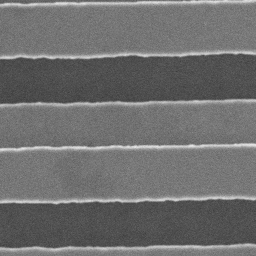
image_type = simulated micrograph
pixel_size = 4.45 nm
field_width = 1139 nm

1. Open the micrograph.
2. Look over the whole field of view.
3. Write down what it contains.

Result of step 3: lines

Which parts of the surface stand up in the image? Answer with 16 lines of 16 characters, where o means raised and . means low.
oooooooooooooooo
oooooooooooooooo
oooooooooooooooo
ooooooo..o......
................
................
.ooooooooooooooo
oooooooooooooooo
oooooooooooooooo
oooooooooooooooo
oooooooooooooooo
oooooooooooooooo
oooooooooo......
................
................
.oo.oooooooooooo